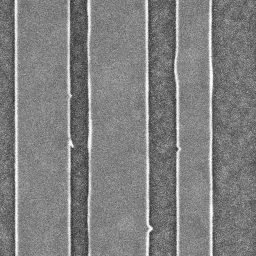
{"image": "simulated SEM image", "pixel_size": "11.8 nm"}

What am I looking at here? one or a few lines or trenches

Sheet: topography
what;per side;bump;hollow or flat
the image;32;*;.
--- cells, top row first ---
..*******..*******....****......
..*******..*******....****......
..*******..*******....****......
..*******..*******....****......
..*******..*******....****......
..*******..*******....****......
..*******..*******....****......
..*******..*******....****......
..*******..*******....****......
..*******..*******....****......
..*******..*******....****......
..*******..*******....****......
..*******..*******....****......
..*******..*******....****......
..*******..*******....****......
..*******..*******....****......
..*******..*******....****......
..*******..*******....****......
..*******..*******....****......
..*******..*******....****......
..*******..*******....****......
..*******..*******....****......
..*******..*******....****......
..*******..*******....****......
..*******..*******....****......
..*******..*******....****......
..*******..*******....****......
..*******..*******....****......
..*******..********...****......
..*******..********...****......
..*******..*******....****......
..*******..*******....****......